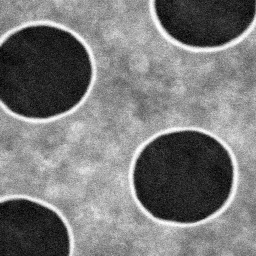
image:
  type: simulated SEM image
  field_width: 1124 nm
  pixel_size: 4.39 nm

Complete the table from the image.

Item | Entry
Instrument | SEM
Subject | holes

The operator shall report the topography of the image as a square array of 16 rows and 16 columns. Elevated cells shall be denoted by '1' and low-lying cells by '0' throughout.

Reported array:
1111111111000000
1111111111000000
0000011111100001
0000001111111111
0000001111111111
0000001111111111
0000011111111111
1111111111111111
1111111111000111
1111111110000011
1111111100000001
1111111100000001
0011111110000011
0000111111000111
0000111111111111
0000111111111111